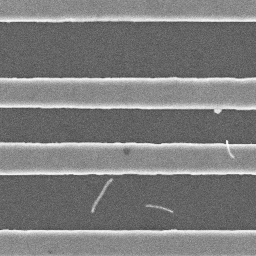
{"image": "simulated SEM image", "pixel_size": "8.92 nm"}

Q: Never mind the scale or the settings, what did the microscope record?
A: lines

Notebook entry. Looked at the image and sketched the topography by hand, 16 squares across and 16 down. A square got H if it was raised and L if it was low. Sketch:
HHHHHHHHHHHHHHHH
LLLLLLLLLLLLLLLL
LLLLLLLLLLLLLLLL
LLLLLLLLLLLLLLLL
LLLLLLLLLLLLLLLL
HHHHHHHHHHHHHHHH
HHHHHHHHHHHHHHHH
LLLLLLLLLLLLLLLL
LLLLLLLLLLLLLLLL
HHHHHHHHHHHHHHHH
HHHHHHHHHHHHHHHH
LLLLLLLLLLLLLLLL
LLLLLLLLLLLLLLLL
LLLLLLLLLLLLLLLL
HHHHHHHHHHHHHHHH
HHHHHHHHHHHHHHHH